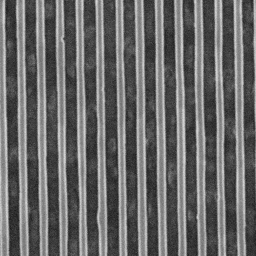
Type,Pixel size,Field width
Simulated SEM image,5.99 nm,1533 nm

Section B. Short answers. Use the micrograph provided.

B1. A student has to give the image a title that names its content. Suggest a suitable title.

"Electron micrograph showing parallel lines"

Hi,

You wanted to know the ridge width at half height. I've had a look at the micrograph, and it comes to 41.2 nanometres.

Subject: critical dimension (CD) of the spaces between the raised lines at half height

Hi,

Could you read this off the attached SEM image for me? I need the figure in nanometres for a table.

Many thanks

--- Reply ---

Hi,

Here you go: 77.8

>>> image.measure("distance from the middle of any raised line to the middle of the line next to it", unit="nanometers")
118